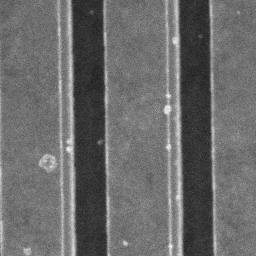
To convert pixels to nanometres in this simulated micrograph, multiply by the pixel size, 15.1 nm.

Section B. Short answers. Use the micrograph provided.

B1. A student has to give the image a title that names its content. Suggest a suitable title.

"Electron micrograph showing lines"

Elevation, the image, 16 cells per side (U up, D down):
UUUUDDDUUUUDDUUU
UUUUDDDUUUUDDUUU
UUUUDDDUUUUDDUUU
UUUUDDDUUUUDDUUU
UUUUDDDUUUUDDUUU
UUUUDDDUUUUDDUUU
UUUUDDDUUUUDDUUU
UUUUDDDUUUUDDUUU
UUUUDDDUUUUDDUUU
UUUUDDDUUUUDDUUU
UUUUUDDUUUUDDUUU
UUUUUDDUUUUDDUUU
UUUUUDDUUUUDDUUU
UUUUUDDUUUUDDUUU
UUUUUDDUUUUDDUUU
UUUUUDDUUUUDDUUU